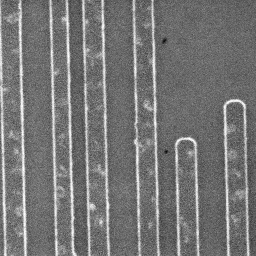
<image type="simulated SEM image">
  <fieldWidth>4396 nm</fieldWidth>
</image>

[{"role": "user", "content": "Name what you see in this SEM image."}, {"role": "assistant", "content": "parallel lines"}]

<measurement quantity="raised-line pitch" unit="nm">754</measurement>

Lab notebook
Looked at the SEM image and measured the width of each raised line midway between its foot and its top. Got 19.7 pixels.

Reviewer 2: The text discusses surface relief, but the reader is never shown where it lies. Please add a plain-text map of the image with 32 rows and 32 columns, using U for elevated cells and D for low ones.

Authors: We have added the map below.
UUUDDDUUDDUUUDDDDUUDDDDDDDDDDDDD
UUUDDDUUDDUUUDDDDUUDDDDDDDDDDDDD
UUUDDDUUDDUUUDDDDUUDDDDDDDDDDDDD
UUDDDDUUUDUUUDDDDUUDDDDDDDDDDDDD
UUDDDDUUDDDUUDDDDUUDDDDDDDDDDDDD
UUUDDDUUDDDUUDDDDUUDDDDDDDDDDDDD
UUUDDDUUDDDUUDDDDUUDDDDDDDDDDDDD
UUUDDDDUUDDUUDDDDUUDDDDDDDDDDDDD
UUUDDDDUUDDUUDDDDUUDDDDDDDDDDDDD
UUUDDDDUUDDUUDDDDUUDDDDDDDDDDDDD
UUUDDDDUUDDUUDDDDUUDDDDDDDDDDDDD
UUUDDDDUUDDUUDDDDUUDDDDDDDDDDDDD
UUUDDDDUUDDUUDDDDUUDDDDDDDDDDDDD
UUUDDDDUUDDUUDDDDUUDDDDDDDDDUUUD
UUUDDDDUUDDUUDDDDUUDDDDDDDDDUUUD
UUUDDDDUUDDUUDDDDUUDDDDDDDDDUUUD
UUUDDDDUUDDUUDDDDUUDDDDDDDDDUUUD
UUUDDDDUUDDUUDDDDUUDDDDUDDDDUUUD
UUUDDDDUUDDUUDDDDUUUDDUUDDDDUUUD
UUUDDDDUUDDUUDDDDUUUDDUUDDDDUUUD
UUUDDDDUUDDUUDDDDUUUDDUUUDDDUUUD
UUUDDDDUUDDUUDDDDUUUDDUUUDDDUUUD
UUUDDDDUUDDUUDDDDUUUDDUUUDDDUUUD
UUUDDDDUUDDUUDDDDUUUDDUUUDDDUUUD
UUUDDDDUUDDUUDDDDUUUDDUUUDDDUUUD
DUUDDDDUUDDUUDDDDUUUDDUUUDDDUUUD
DUUDDDDUUDDUUDDDDUUUDDUUUDDDUUUD
DUUDDDDUUDDUUDDDDUUUDDUUUDDDUUUD
DUUDDDDUUDDUUDDDDUUUDDUUUDDDDUUD
DUUDDDDUUDDUUDDDDUUUDDUUUDDDDUUD
DUUDDDDUUDDUUDDDDUUUDDUUUDDDDUUD
DUUDDDDUUDDUUUDDDUUUDDUUUDDDDUUD